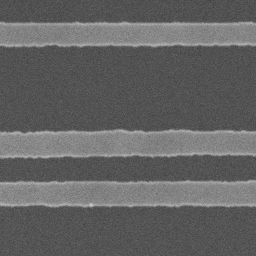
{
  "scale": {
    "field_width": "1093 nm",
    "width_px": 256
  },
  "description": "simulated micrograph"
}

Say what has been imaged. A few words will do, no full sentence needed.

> lines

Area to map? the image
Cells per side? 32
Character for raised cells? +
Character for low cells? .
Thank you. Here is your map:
................................
................................
................................
++++++++++++++++++++++++++++++++
++++++++++++++++++++++++++++++++
++++++++++++++++++++++++++++++++
................................
................................
................................
................................
................................
................................
................................
................................
................................
................................
.....+..++..++++++..+++++.+++++.
++++++++++++++++++++++++++++++++
++++++++++++++++++++++++++++++++
++++++++.+++.+.+..++++..........
................................
................................
................................
++++++++++++++++++++++++++++++++
++++++++++++++++++++++++++++++++
++++++++++++++++++++++++++++++++
................................
................................
................................
................................
................................
................................